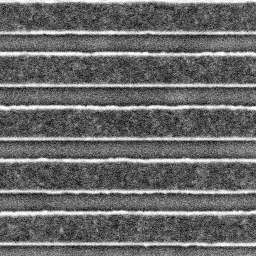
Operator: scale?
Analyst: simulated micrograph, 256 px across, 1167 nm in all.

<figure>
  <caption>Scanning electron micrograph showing lines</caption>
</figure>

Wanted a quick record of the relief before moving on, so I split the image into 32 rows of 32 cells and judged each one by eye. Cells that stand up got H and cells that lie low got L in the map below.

HHHHHHHHHHHHHHHHHHHHHHHHHHHHHHHH
HHHHHHHHHHHHHHHHHHHHHHHHHHHHHHHH
HHHHHHHHHHHHHHHHHHHHHHHHHHHHHHHH
HHHHHHHHHHHHHHHHHHHHHHHHHHHHHHHH
LLLLLLLLLLLLLLLLLLLLLLLLLLLLLLLL
LLLLLLLLLLLLLLLLLLLLLLLLLLLLLLLL
LLLLLLLLLLLLLLLLLLLLLLLLLLLLLLLL
HHHHHHHHHHHHHHHHHHHHHHHHHHHHHHHH
HHHHHHHHHHHHHHHHHHHHHHHHHHHHHHHH
HHHHHHHHHHHHHHHHHHHHHHHHHHHHHHHH
HHHHHHHHHHHHHHHHHHHHHHHHHHHHHHHH
LLLLLLLLLLLLLLLLLLLLLLLLLLLLLLLL
LLLLLLLLLLLLLLLLLLLLLLLLLLLLLLLL
HHHHHHHHHHHHHHHHHHHHHHHHHHHHHHHH
HHHHHHHHHHHHHHHHHHHHHHHHHHHHHHHH
HHHHHHHHHHHHHHHHHHHHHHHHHHHHHHHH
HHHHHHHHHHHHHHHHHHHHHHHHHHHHHHHH
LLLLLLLLLLLLLLLLLLLLLLLLLLLLLLLL
LLLLLLLLLLLLLLLLLLLLLLLLLLLLLLLL
LLLLLLLLLLLLLLLLLLLLLLLLLLLLLLLL
HHHHHHHHHHHHHHHHHHHHHHHHHHHHHHHH
HHHHHHHHHHHHHHHHHHHHHHHHHHHHHHHH
HHHHHHHHHHHHHHHHHHHHHHHHHHHHHHHH
HHHHHHHHHHHHHHHHHHHHHHHHHHHHHHHH
LLLLLLLLLLLLLLLLLLLLLLLLLLLLLLLL
LLLLLLLLLLLLLLLLLLLLLLLLLLLLLLLL
LLLLLLLLLLLLLLHHLLLLLLLLLLLLLLLH
HHHHHHHHHHHHHHHHHHHHHHHHHHHHHHHH
HHHHHHHHHHHHHHHHHHHHHHHHHHHHHHHH
HHHHHHHHHHHHHHHHHHHHHHHHHHHHHHHH
HHHHHHHHHHHHHHHHHHHHHHHHHHHHHHHH
LLLLLLLLLLLLLLLLLLLLLLLLLLLLLLLL